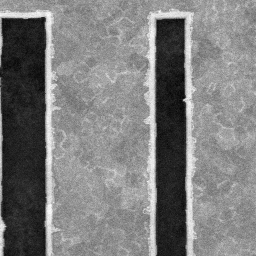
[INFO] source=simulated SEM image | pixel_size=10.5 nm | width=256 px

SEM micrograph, one or a few lines or trenches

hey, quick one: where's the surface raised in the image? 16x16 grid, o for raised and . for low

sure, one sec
oooooooooooooooo
...ooooooo..oooo
...oooooo...oooo
...oooooo...oooo
...oooooo...oooo
...oooooo...oooo
...ooooooo..oooo
...ooooooo..oooo
...ooooooo..oooo
...ooooooo..oooo
...ooooooo..oooo
...ooooooo..oooo
...ooooooo..oooo
...ooooooo..oooo
...ooooooo..oooo
...ooooooo..oooo